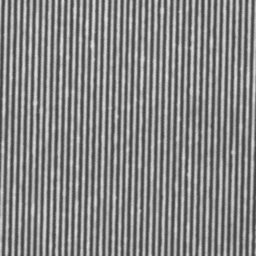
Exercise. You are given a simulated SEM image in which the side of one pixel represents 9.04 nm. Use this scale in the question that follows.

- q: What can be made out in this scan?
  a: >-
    parallel lines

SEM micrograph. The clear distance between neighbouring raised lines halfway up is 35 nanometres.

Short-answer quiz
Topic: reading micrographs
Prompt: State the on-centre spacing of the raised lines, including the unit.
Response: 56.5 nm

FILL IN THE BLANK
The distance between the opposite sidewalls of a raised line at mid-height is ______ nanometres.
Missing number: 18.1